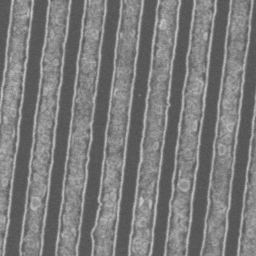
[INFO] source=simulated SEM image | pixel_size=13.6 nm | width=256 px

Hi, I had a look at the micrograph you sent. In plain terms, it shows parallel lines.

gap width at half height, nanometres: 281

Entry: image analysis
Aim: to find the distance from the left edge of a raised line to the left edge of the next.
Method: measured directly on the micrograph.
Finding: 493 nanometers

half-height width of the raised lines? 212 nm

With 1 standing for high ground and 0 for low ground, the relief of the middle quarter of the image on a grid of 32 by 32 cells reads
11100000011110000011110000011110
11100000011110000011110000011110
11100000011110000011110000011110
11100000111100000011100000011110
11100000111100000111100000011100
11100000111100000111100000111100
11100000111100000111100000111100
11100000111100000111100000111100
11100000111100000111100000111100
11000000111100000111100000111100
11000001111100000111100000111100
11000001111000001111100000111100
11000001111000001111000000111000
11000001111000001111000000111000
11000001111000001111000000111000
11000001111000001111000001111000
11000001111000001111000001111000
11000001110000001111000001111000
10000001110000001111000001111000
10000001110000011110000001110000
10000001110000011110000001110000
10000011110000011110000001110000
10000011110000011110000011110000
10000011110000011110000011110000
10000011110000011110000011110000
00000011110000011110000011110000
00000011110000011110000011110000
00000011110000011110000011110000
00000011100000011110000011100000
00000111100000011100000111100000
00000111100000111100000011100000
00000111100000111100000111100000